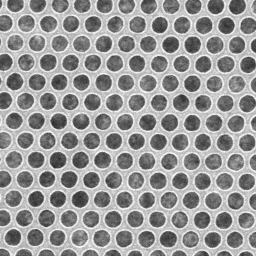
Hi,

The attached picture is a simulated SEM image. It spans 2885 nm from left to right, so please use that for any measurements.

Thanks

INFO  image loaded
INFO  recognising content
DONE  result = a regular array of holes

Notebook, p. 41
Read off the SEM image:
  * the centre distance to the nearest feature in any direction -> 0.248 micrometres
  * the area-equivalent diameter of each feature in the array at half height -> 201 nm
